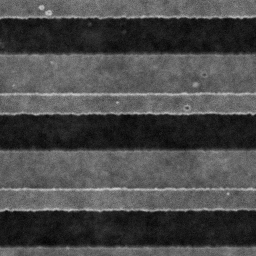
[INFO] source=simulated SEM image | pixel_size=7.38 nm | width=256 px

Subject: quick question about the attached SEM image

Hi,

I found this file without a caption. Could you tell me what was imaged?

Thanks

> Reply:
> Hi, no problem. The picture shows lines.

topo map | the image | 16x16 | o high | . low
oooooooooooooooo
................
................
oooooooooooooooo
oooooooooooooooo
oooooooooooooooo
oooooooooooooooo
................
................
oooooooooooooooo
oooooooooooooooo
oooooooooooooooo
oooooooooooooooo
................
................
.ooooooo.ooooooo